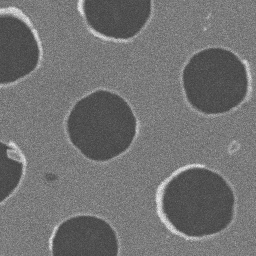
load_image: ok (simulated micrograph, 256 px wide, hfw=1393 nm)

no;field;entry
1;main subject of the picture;holes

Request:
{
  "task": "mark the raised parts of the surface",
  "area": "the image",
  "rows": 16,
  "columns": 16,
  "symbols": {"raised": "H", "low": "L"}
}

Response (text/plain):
HHHHHLLLLHHHHHHH
LLHHHHLLLHHHHHHH
LLHHHHHHHHHHHHHH
LLHHHHHHHHHHLLLH
LLHHHHHHHHHLLLLH
HHHHHHHHHHHHLLLH
HHHHHLLLHHHHLLLH
HHHHLLLLHHHHHHHH
HHHHLLLLHHHHHHHH
LHHHHLLLHHHHHHHH
LHHHHHHHHHHHHHHH
LHHHHHHHHHHLLLHH
HHHHHHHHHHLLLLLH
HHHHHHHHHHLLLLLH
HHHHLLLHHHHLLLHH
HHHLLLLHHHHHHHHH